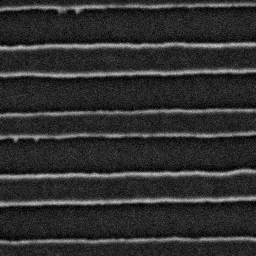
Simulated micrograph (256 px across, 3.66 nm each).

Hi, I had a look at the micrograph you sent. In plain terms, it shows lines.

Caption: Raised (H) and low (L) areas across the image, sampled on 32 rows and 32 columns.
HHHHHHHHHHHHHHHHHHHHHHHHHHHHHHHH
LLLLLLLLLLLLLLLLLLLLLLLLLLLLLLLL
LLLLLLLLLLLLLLLLLLLLLLLLLLLLLLLL
LLLLLLLLLLLLLLLLLLLLLLLLLLLLLLLL
LLLLLLLLLLLLLLLLLLLLLLLLLLLLLLLL
LLLLLLLLLLLLLLLLLLLLHHHLLLLLHHHH
HHHHHHHHHHHHHHHHHHHHHHHHHHHHHHHH
HHHHHHHHHHHHHHHHHHHHHHHHHHHHHHHH
HHHHHHHHHHHHHHHHHHHHHHHHHHHHHHHH
LLLLLLHHHHLLLLLLLLLLLLLLLLLLLLLL
LLLLLLLLLLLLLLLLLLLLLLLLLLLLLLLL
LLLLLLLLLLLLLLLLLLLLLLLLLLLLLLLL
LLLLLLLLLLLLLLLLLLLLLLLLLLLLLLLL
LLLLLLLLLLLLLLLLLLLLLLLLLLLLLLLL
HHHHHHHHHHHHHHHHHHHHHHHHHHHHHHHH
HHHHHHHHHHHHHHHHHHHHHHHHHHHHHHHH
HHHHHHHHHHHHHHHHHHHHHHHHHHHHHHHH
LLLLLLLLLLLLLLLLLLLLLLLLLLLLLLLL
LLLLLLLLLLLLLLLLLLLLLLLLLLLLLLLL
LLLLLLLLLLLLLLLLLLLLLLLLLLLLLLLL
LLLLLLLLLLLLLLLLLLLLLLLLLLLLLLLL
LLLLLLLLLLLLLLLLLLLLLLLLLLLLLHHH
HHHHHHHHHHHHHHHHHHHHHHHHHHHHHHHH
HHHHHHHHHHHHHHHHHHHHHHHHHHHHHHHH
HHHHHHHHHHHHHHHHHHHHHHHHHHHHHHHH
HHHHHLLLLLLLLLLLLLLLLLLLLLLLLLLL
LLLLLLLLLLLLLLLLLLLLLLLLLLLLLLLL
LLLLLLLLLLLLLLLLLLLLLLLLLLLLLLLL
LLLLLLLLLLLLLLLLLLLLLLLLLLLLLLLL
LLLLLLLLLLLLLLLLLLLLLLLLLLLLLLLL
HHHHHHHHHHHHHHHHHHHHHHHHHHHHHHHH
HHHHHHHHHHHHHHHHHHHHHHHHHHHHHHHH